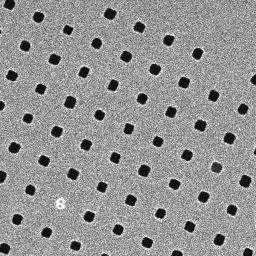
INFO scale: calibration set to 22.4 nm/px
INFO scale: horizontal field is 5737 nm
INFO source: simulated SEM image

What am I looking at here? a regular array of holes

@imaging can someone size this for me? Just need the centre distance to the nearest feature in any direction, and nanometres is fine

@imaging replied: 712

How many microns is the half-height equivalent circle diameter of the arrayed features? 0.257